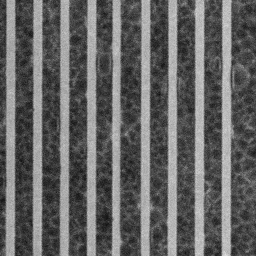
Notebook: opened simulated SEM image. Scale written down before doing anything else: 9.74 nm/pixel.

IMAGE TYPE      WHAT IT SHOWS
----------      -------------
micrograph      parallel lines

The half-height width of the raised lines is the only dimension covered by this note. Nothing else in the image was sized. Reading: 0.0828 microns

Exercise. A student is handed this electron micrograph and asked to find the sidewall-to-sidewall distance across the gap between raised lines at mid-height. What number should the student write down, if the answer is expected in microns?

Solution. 0.18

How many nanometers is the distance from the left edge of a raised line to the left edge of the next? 263